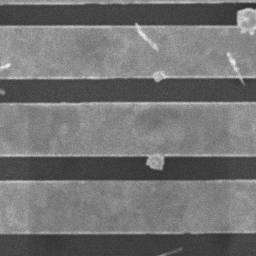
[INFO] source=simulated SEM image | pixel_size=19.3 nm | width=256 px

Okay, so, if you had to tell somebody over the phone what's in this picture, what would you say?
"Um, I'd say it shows lines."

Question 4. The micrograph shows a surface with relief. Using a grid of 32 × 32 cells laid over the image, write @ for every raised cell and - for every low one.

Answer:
--------------------------------
------------------------------@@
------------------------------@@
@@@@@@@@@@@@@@@@@@@@@@@@@@@@@@@@
@@@@@@@@@@@@@@@@@@@@@@@@@@@@@@@@
@@@@@@@@@@@@@@@@@@@@@@@@@@@@@@@@
@@@@@@@@@@@@@@@@@@@@@@@@@@@@@@@@
@@@@@@@@@@@@@@@@@@@@@@@@@@@@@@@@
@@@@@@@@@@@@@@@@@@@@@@@@@@@@@@@@
@@@@@@@@@@@@@@@@@@@@@@@@@@@@@@@@
--------------------------------
--------------------------------
--------------------------------
@@@@@@@@@@@@@@@@@@@@@@@@@@@@@@@@
@@@@@@@@@@@@@@@@@@@@@@@@@@@@@@@@
@@@@@@@@@@@@@@@@@@@@@@@@@@@@@@@@
@@@@@@@@@@@@@@@@@@@@@@@@@@@@@@@@
@@@@@@@@@@@@@@@@@@@@@@@@@@@@@@@@
@@@@@@@@@@@@@@@@@@@@@@@@@@@@@@@@
------------------@@@-----------
-------------------@------------
--------------------------------
--------------------------------
@@@@@@@@@@@@@@@@@@@@@@@@@@@@@@@@
@@@@@@@@@@@@@@@@@@@@@@@@@@@@@@@@
@@@@@@@@@@@@@@@@@@@@@@@@@@@@@@@@
@@@@@@@@@@@@@@@@@@@@@@@@@@@@@@@@
@@@@@@@@@@@@@@@@@@@@@@@@@@@@@@@@
@@@@@@@@@@@@@@@@@@@@@@@@@@@@@@@@
--------------------------------
--------------------------------
--------------------------------